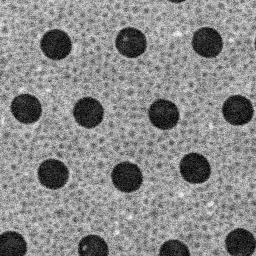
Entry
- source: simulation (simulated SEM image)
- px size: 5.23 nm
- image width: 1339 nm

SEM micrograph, a regular array of holes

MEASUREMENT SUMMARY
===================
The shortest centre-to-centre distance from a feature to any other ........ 364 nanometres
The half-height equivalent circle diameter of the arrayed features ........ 172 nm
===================